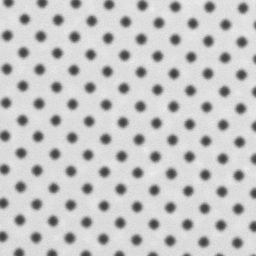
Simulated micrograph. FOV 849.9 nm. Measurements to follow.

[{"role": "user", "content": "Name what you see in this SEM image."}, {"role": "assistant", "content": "a regular array of holes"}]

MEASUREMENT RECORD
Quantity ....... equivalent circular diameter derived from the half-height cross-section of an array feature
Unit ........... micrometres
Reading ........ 0.0346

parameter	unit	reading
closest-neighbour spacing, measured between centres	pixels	23.4